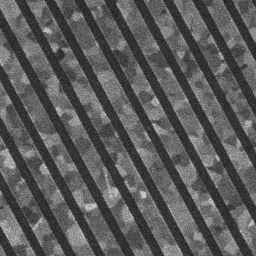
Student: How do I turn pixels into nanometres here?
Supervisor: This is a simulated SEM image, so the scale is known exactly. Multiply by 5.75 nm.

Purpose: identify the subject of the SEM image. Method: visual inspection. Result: parallel lines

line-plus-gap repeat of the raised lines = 149 nanometers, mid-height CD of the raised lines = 90.3 nm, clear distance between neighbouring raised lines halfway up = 0.0587 µm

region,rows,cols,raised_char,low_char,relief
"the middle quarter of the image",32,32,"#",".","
####...####...#####...####...###
####...#####...####...#####...##
.####...####...#####...####...##
.####...#####...####...#####...#
..####...#####..#####...####...#
..#####...####...####...#####...
...####...#####...####...####...
...#####...####...#####...####..
#...####...#####...####...####..
#...#####...####...#####...####.
##...####...#####...####...#####
##...#####...####...#####...####
###...####...#####...####...####
####...####...####...#####...###
####...####...#####...####...###
#####...####...#####...####...##
.####...#####...####...####...##
.#####...####...#####...####...#
..####...#####...####...#####...
..#####...####...#####...####...
...####...#####...####...#####..
#...####...####...#####...####..
#...####...#####...####...#####.
##...####...####....####...####.
##...#####...####...####...#####
###...####...####....####...####
###...#####...####...#####..####
####...####...#####...####...###
####...#####...####...#####..###
.####...####...#####...####...##
.####...#####...####...#####...#
..####...####...#####...####...#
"